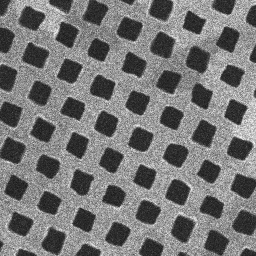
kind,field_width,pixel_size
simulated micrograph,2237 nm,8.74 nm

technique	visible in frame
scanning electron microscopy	a regular array of holes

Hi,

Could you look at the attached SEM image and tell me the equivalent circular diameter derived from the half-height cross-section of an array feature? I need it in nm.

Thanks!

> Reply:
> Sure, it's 201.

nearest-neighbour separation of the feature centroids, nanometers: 315